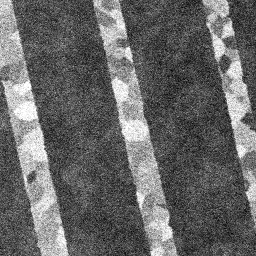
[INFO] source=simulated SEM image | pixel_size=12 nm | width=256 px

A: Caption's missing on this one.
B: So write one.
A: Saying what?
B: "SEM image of one or a few lines or trenches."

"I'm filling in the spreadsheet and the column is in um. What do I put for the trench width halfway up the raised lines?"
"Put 0.973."